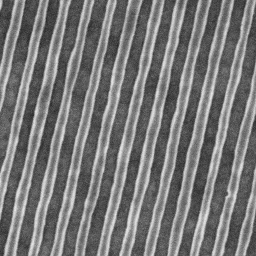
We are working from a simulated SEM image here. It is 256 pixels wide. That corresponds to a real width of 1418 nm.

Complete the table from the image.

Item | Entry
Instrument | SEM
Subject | parallel lines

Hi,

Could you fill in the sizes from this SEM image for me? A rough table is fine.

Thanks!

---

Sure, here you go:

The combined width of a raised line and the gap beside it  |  125 nm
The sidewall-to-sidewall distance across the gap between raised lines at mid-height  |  0.073 micrometres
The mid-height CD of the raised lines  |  53.3 nm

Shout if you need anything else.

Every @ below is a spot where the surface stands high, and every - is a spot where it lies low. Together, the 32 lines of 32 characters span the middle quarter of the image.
-@@@---@@---@@@----@@----@@---@@
-@@@---@@---@@@----@@---@@@---@@
-@@----@@---@@@----@@---@@@---@@
-@@----@@---@@@---@@@---@@---@@@
@@@---@@@---@@@---@@----@@---@@@
@@----@@----@@----@@---@@@---@@@
@@----@@---@@@---@@@---@@@---@@@
@@----@@---@@@---@@@---@@@---@@-
@@---@@@---@@@---@@@---@@----@@-
@@---@@----@@----@@----@@---@@@-
@----@@----@@----@@---@@@---@@@-
@----@@----@@---@@@---@@@---@@--
@----@@---@@@---@@@---@@----@@--
@---@@@---@@@---@@@---@@----@@--
----@@----@@----@@---@@@---@@@--
----@@---@@@---@@@---@@@---@@---
----@@---@@@---@@@---@@@---@@---
---@@@---@@@---@@@---@@@---@@---
---@@----@@----@@---@@@---@@@---
---@@----@@----@@---@@@---@@@---
---@@----@@---@@@---@@@---@@@--@
--@@@---@@@---@@@---@@----@@---@
--@@@---@@----@@@---@@----@@---@
--@@----@@----@@----@@----@@---@
--@@----@@---@@@---@@@---@@@--@@
--@@---@@@---@@@---@@@---@@@--@@
--@@---@@@---@@@---@@@---@@---@@
-@@----@@@---@@----@@----@@---@@
-@@----@@----@@---@@@---@@@---@@
-@@----@@----@@---@@@---@@@---@@
-@@---@@@---@@@---@@@---@@---@@@
-@@---@@@---@@@---@@----@@---@@@